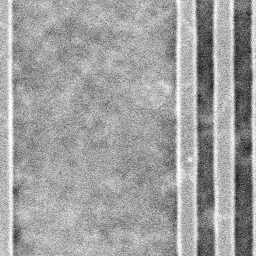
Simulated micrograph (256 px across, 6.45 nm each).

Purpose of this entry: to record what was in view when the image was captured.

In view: wiring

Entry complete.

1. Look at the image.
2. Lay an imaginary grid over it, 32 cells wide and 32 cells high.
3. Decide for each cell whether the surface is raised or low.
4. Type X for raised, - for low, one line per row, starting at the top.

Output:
X---------------------XX---XX---
X---------------------XX---XX---
X---------------------XX---XX---
X---------------------XX---XX---
X---------------------XX---XX---
X---------------------XX---XX---
X---------------------XX---XX---
X---------------------XX---XX---
X---------------------XX---XX---
X---------------------XX---XX---
X---------------------XX---XX---
X---------------------XX---XX---
X---------------------XX---XX---
X---------------------XX---XX---
X---------------------XX---XX---
X---------------------XX---XX---
X---------------------XX---XX---
X---------------------XX---XX---
X---------------------XX---XX---
X---------------------XX---XX---
X---------------------XX---XX---
X---------------------XX---XX---
X---------------------XX---XX---
X---------------------XX---XX---
X---------------------XX---XX---
X---------------------XX---XX---
X---------------------XX---XX---
X---------------------XX---XX---
X---------------------XX---XX---
X---------------------XX---XX---
X---------------------XX---XX---
X---------------------XX---XX---